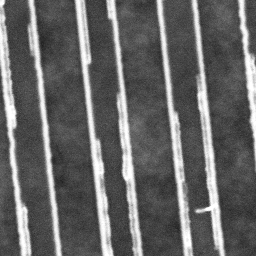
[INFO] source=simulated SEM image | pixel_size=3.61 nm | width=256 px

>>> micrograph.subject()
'one or a few lines or trenches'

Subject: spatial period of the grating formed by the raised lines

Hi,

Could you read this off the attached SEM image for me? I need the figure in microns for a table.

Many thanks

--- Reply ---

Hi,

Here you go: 0.293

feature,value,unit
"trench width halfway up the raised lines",0.163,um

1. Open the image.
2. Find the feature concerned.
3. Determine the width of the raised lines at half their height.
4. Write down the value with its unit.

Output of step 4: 130 nanometres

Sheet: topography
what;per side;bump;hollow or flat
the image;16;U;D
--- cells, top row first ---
UUDDDUUDDDUUDDDU
UUDDDUUDDDUUDDDU
UUDDDUUDDDUUDDDU
UUDDDUUDDDUUUDDU
UUDDDUUUDDUUUDDD
UUUDDUUUDDDUUDDD
UUUDDDUUDDDUUDDD
DUUDDDUUDDDUUDDD
DUUDDDUUDDDUUDDD
DUUDDDUUDDDUUDDD
DUUDDDUUDDDUUDDD
DUUDDDUUDDDUUDDD
DUUDDDUUDDDUUUDD
DUUDDDUUUDDUUUDD
DUUUDDUUUDDUUUDD
DUUUDDUUUDDDUUDD